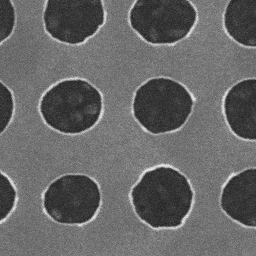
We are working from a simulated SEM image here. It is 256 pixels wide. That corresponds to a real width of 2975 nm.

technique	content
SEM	holes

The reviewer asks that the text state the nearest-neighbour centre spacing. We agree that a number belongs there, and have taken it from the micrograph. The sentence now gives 1.05 um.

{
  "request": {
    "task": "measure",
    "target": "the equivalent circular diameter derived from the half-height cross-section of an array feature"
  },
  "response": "56.7 px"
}